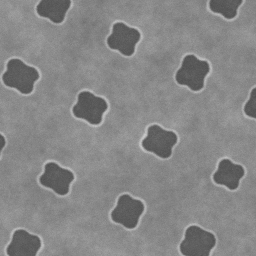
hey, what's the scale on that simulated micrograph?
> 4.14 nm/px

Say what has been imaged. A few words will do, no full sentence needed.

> a regular array of holes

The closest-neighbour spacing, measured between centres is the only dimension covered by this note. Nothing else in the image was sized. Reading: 318 nanometers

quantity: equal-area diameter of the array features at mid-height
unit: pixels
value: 33.3